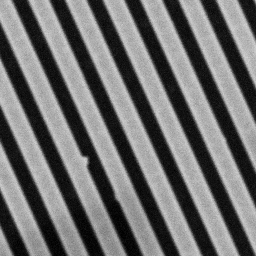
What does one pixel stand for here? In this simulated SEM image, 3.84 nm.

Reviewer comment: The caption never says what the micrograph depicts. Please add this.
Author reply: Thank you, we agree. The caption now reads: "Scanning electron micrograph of parallel lines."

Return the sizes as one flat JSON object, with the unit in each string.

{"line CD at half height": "71.4 nm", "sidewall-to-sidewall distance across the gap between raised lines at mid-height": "61.3 nm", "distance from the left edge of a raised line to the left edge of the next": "132 nanometers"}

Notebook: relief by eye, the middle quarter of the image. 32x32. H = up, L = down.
HHHLLLLLHHHHHLLLLHHHHHLLLLLHHHHH
HHHHLLLLHHHHHLLLLLHHHHHLLLLHHHHH
HHHHLLLLLHHHHHLLLLHHHHHLLLLLHHHH
HHHHHLLLLHHHHHLLLLLHHHHHLLLLHHHH
HHHHHLLLLLHHHHHLLLLHHHHHLLLLLHHH
LHHHHHLLLLHHHHHLLLLLHHHHHLLLLHHH
LHHHHHLLLLLHHHHHLLLLHHHHHLLLLLHH
LLHHHHHLLLLHHHHHLLLLLHHHHHLLLLHH
LLHHHHHLLLLLHHHHHLLLLHHHHHLLLLHH
LLLHHHHHLLLLHHHHHLLLLHHHHHLLLLLH
LLLHHHHHLLLLHHHHHLLLLLHHHHHLLLLH
LLLLHHHHLLLLLHHHHHLLLLHHHHHLLLLL
LLLLHHHHHLLLLHHHHHLLLLLHHHHHLLLL
LLLLLHHHHLLLLLHHHHHLLLLHHHHHLLLL
HLLLLHHHHHLLLLHHHHHLLLLLHHHHHLLL
HLLLLHHHHHLLLLLHHHHHLLLLHHHHHLLL
HLLLLLHHHHHLLLLHHHHHLLLLLHHHHHLL
HHLLLLHHHHHLLLLLHHHHHLLLLHHHHHLL
HHLLLLLHHHHHLLLLHHHHHLLLLHHHHHHL
HHHLLLLHHHHHLLLLHHHHHLLLLLHHHHHL
HHHLLLLLHHHHLLLLLHHHHHLLLLHHHHHL
HHHHLLLLHHHHHLLLLHHHHHLLLLLHHHHH
HHHHLLLLLHHHHLLLLLHHHHHLLLLHHHHH
HHHHHHLLLHHHHHLLLLHHHHHLLLLLHHHH
HHHHHHLLLHHHHHLLLLLHHHHHLLLLHHHH
HHHHHHLLLLHHHHHLLLLHHHHHLLLLLHHH
LHHHHHLLLLHHHHHLLLLLHHHHHLLLLHHH
LHHHHHLLLLLHHHHHLLLLHHHHHLLLLLHH
LLHHHHHLLLLHHHHHLLLLLHHHHHLLLLHH
LLHHHHHLLLLLHHHHHLLLLHHHHHLLLLHH
LLLHHHHHLLLLHHHHHLLLLHHHHHLLLLLH
LLLHHHHHLLLLLHHHHLLLLLHHHHHLLLLH